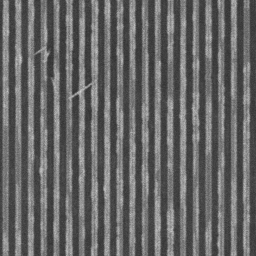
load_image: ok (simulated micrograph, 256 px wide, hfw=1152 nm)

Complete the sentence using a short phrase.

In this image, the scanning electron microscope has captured parallel lines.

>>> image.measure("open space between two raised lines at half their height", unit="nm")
31.5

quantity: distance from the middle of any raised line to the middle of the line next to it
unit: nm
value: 57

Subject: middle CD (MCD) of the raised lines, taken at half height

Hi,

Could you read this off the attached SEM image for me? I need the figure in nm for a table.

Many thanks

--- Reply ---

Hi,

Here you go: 23.6